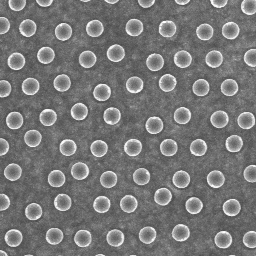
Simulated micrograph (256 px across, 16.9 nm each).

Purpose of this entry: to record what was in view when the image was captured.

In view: a regular array of raised bodies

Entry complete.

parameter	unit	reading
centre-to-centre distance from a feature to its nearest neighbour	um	0.494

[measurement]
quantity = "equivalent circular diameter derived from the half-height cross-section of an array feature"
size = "16.9 pixels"